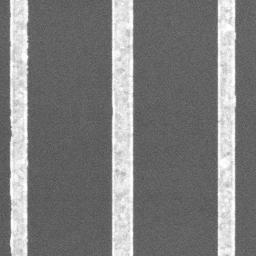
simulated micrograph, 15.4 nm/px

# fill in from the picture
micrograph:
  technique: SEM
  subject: lines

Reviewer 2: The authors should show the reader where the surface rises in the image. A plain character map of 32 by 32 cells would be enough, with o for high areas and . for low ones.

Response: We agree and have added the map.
.oo...........oo...........oo...
.oo...........oo...........oo...
.oo...........oo...........oo...
.oo...........oo...........oo...
.oo...........oo...........oo...
.oo...........oo...........oo...
.oo...........oo...........oo...
.oo...........oo...........oo...
.oo...........oo...........oo...
.oo...........oo...........oo...
.oo...........oo...........oo...
.oo...........oo...........oo...
.oo...........oo...........oo...
.oo...........oo...........oo...
.oo...........oo...........oo...
.oo...........oo...........oo...
..o...........oo...........oo...
.oo...........oo...........oo...
.oo...........oo...........oo...
.oo...........oo...........oo...
.oo...........oo...........oo...
.oo...........oo...........oo...
.oo...........oo...........oo...
.oo...........oo...........oo...
.oo...........oo...........oo...
.oo...........oo...........oo...
..o...........oo...........oo...
.oo...........oo...........oo...
.oo...........oo...........oo...
.oo...........ooo..........oo...
.oo...........ooo..........oo...
.oo...........oo...........oo...